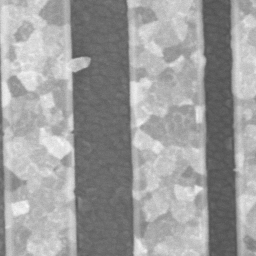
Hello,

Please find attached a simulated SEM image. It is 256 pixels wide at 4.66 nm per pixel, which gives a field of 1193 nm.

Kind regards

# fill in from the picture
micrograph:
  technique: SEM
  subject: one or a few lines or trenches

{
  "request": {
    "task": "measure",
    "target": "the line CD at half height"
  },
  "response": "322 nm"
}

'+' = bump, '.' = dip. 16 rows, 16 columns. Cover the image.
++++....+++++..+
++++....+++++..+
++++....+++++..+
+++++...+++++..+
+++++...+++++..+
++++....+++++..+
++++....+++++..+
++++....+++++..+
++++....+++++..+
++++....+++++..+
+++++...+++++..+
++++....+++++..+
+++++...+++++..+
+++++....++++..+
.++++....++++..+
.++++....++++..+